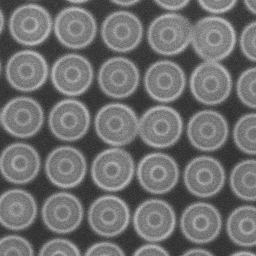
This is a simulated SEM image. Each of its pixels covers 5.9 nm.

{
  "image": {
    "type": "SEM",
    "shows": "an array of small figures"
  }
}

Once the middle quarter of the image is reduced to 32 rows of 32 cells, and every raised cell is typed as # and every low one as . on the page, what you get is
......####.......######.....####
.###..####........####.......###
####...##...###...###....#...###
.###..###...####..###...###...##
......###...###...###..####...##
.....#####........###...###..###
.....#####.......####........###
############...#######......####
#######################....#####
#.##############################
....#########.##################
.....#####......#######...######
.#....###........####.......####
###...###...##...###........####
###...##...####...##...###...###
###..###...###....#....###...###
.....####...##....#....###...##.
....#####........###....#...####
..########......####........####
############...######......#####
################################
..##############################
....######.....#################
....#####.......#####.....######
##...###........####.......#####
##...###...##....##.........###.
##...##...####...##...###...###.
.....###..####...##...###...###.
....####........###...###...###.
...#####.......#####........###.
##########....#######......####.
######################...#######